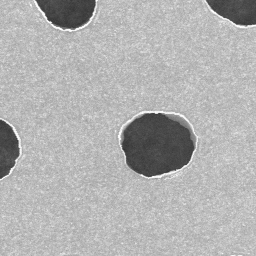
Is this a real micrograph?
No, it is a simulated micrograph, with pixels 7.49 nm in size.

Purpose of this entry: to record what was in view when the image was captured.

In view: holes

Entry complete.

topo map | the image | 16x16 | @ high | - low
@@----@@@@@@@---
@@@--@@@@@@@@@@-
@@@@@@@@@@@@@@@@
@@@@@@@@@@@@@@@@
@@@@@@@@@@@@@@@@
@@@@@@@@@@@@@@@@
@@@@@@@@@@@@@@@@
@@@@@@@@---@@@@@
-@@@@@@@----@@@@
-@@@@@@@----@@@@
-@@@@@@@---@@@@@
@@@@@@@@@@@@@@@@
@@@@@@@@@@@@@@@@
@@@@@@@@@@@@@@@@
@@@@@@@@@@@@@@@@
@@@@@@@@@@@@@@@@